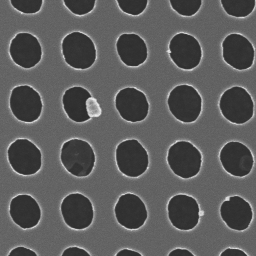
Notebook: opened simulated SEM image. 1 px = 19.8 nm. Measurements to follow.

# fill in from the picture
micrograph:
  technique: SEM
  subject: a regular array of holes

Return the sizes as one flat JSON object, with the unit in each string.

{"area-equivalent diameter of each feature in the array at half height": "0.67 µm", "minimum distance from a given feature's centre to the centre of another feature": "1.04 microns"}